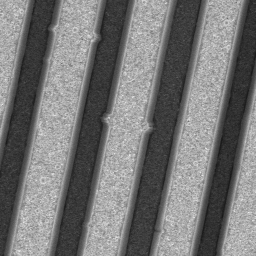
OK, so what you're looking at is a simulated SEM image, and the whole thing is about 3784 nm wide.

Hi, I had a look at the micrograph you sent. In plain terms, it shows one or a few lines or trenches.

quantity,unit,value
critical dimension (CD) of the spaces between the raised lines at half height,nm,422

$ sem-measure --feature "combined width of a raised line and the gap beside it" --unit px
70.6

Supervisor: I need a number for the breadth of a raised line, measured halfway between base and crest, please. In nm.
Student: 590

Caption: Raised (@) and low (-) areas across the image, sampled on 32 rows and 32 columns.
@@@@---@@@@@@---@@@@@@----@@@@@-
@@@----@@@@@@---@@@@@----@@@@@--
@@@----@@@@@----@@@@@----@@@@@--
@@@---@@@@@@----@@@@@----@@@@@--
@@@---@@@@@@----@@@@@----@@@@@--
@@@---@@@@@@---@@@@@@----@@@@@--
@@@---@@@@@@---@@@@@----@@@@@---
@@----@@@@@----@@@@@----@@@@@---
@@----@@@@@----@@@@@----@@@@@---
@@---@@@@@@----@@@@@----@@@@@---
@@---@@@@@@---@@@@@@----@@@@@---
@@---@@@@@----@@@@@----@@@@@----
@----@@@@@----@@@@@----@@@@@---@
@----@@@@@----@@@@@----@@@@@---@
@---@@@@@@---@@@@@@----@@@@@---@
@---@@@@@@---@@@@@@---@@@@@@---@
@---@@@@@----@@@@@@---@@@@@---@@
----@@@@@----@@@@@----@@@@@---@@
----@@@@@----@@@@@----@@@@@---@@
---@@@@@@----@@@@@----@@@@@---@@
---@@@@@@---@@@@@----@@@@@@---@@
---@@@@@@---@@@@@----@@@@@---@@@
---@@@@@----@@@@@----@@@@@---@@@
---@@@@@----@@@@@----@@@@@---@@@
--@@@@@@----@@@@@----@@@@@---@@@
--@@@@@@---@@@@@----@@@@@@---@@@
--@@@@@----@@@@@----@@@@@---@@@@
--@@@@@----@@@@@----@@@@@---@@@@
--@@@@@----@@@@@----@@@@@---@@@@
-@@@@@@----@@@@@----@@@@@---@@@@
-@@@@@@---@@@@@----@@@@@@---@@@@
-@@@@@@---@@@@@----@@@@@----@@@@